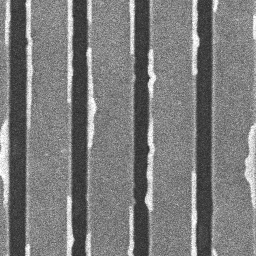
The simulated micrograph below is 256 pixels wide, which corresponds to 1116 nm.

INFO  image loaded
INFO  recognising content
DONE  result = one or a few lines or trenches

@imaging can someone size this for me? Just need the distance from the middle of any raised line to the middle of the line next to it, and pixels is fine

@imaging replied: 61.7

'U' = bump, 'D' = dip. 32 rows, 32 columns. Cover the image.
UDDUUUUUUDDUUUUUUDDUUUUUUDDUUUUU
UDDUUUUUUDDUUUUUUDDUUUUUUDDUUUUU
UDDUUUUUUDDUUUUUUDDUUUUUUDDUUUUU
UDDUUUUUUDDUUUUUUDDUUUUUUDDUUUUU
UDDUUUUUUDDUUUUUUDDUUUUUUDDUUUUU
UDDUUUUUUDDUUUUUUDDUUUUUUDDUUUUU
UDDUUUUUUDDUUUUUUDDUUUUUUDDUUUUU
UDDUUUUUUDDUUUUUUDDUUUUUUDDUUUUU
UDDUUUUUUDDUUUUUUDDUUUUUUDDUUUUU
UDDUUUUUUDDUUUUUUDDUUUUUUDDUUUUU
UDDUUUUUUDDUUUUUUDDUUUUUDDDUUUUU
UDDUUUUUUDDUUUUUUDDUUUUUDDDUUUUU
UDDUUUUUUDDUUUUUUDDUUUUUDDDUUUUU
UDDUUUUUUDDUUUUUUDDUUUUUDDDUUUUU
UDDUUUUUUDDUUUUUUDDUUUUUDDDUUUUU
UDDUUUUUUDDUUUUUUDDUUUUUDDDUUUUU
UDDUUUUUUDDUUUUUUDDUUUUUDDDUUUUU
UDDUUUUUUDDUUUUUUDDUUUUUDDDUUUUU
UDDUUUUUUDDUUUUUUDDUUUUUDDDUUUUU
UDDUUUUUUDDUUUUUUDDUUUUUDDDUUUUU
UDDUUUUUUDDUUUUUUDDUUUUUDDDUUUUU
UDDUUUUUUDDUUUUUUDUUUUUUDDDUUUUU
UDDUUUUUUDDUUUUUUDUUUUUUDDUUUUUU
UDDUUUUUUDDUUUUUUDUUUUUUDDUUUUUU
UDDUUUUUUDDUUUUUUDUUUUUUDDDUUUUU
UDDUUUUUUDDUUUUUUDUUUUUUDDDUUUUU
UDDUUUUUUDDUUUUUUDDUUUUUUDDUUUUU
UDDUUUUUUDDUUUUUUDDUUUUUUDDUUUUU
UDDUUUUUUDDUUUUUUDDUUUUUDDDUUUUU
UDDUUUUUUDDUUUUUUDDUUUUUDDDUUUUU
UDDUUUUUUDDUUUUUUDDUUUUUUDDUUUUU
UDDUUUUUUDDUUUUUUDDUUUUUUDDUUUUU